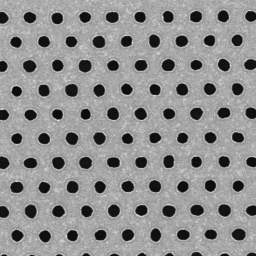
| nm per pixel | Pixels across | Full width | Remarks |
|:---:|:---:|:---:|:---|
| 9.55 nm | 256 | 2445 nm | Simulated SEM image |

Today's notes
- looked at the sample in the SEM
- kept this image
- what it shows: a regular array of holes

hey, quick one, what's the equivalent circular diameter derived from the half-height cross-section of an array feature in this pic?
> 114 nanometres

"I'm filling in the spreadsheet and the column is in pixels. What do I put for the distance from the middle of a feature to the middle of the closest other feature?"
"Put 27.4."